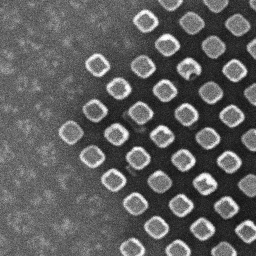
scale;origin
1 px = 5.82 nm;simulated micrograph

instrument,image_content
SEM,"a regular array of raised bodies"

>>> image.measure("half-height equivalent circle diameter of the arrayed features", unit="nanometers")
127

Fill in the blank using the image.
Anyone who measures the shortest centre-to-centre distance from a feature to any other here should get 186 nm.